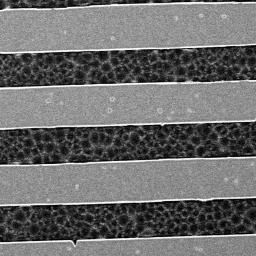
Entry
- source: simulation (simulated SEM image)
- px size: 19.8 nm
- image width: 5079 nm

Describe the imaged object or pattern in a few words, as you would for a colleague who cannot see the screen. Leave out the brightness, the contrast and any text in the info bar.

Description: one or a few lines or trenches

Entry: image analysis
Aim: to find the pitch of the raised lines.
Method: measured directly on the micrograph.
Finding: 1530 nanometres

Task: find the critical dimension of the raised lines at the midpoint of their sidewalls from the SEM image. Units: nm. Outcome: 811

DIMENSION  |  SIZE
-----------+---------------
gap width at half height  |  0.724 um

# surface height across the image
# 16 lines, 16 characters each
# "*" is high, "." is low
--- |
....************
****************
****************
................
................
..**************
****************
****************
................
................
****************
****************
**********......
................
................
****************